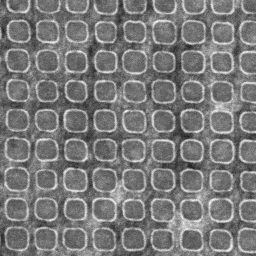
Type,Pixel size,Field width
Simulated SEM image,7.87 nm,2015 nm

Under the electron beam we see a regular array of raised bodies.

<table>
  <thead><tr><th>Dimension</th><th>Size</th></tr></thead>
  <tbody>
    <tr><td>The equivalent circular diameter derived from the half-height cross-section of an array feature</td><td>186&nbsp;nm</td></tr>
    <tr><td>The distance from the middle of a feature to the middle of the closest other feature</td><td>228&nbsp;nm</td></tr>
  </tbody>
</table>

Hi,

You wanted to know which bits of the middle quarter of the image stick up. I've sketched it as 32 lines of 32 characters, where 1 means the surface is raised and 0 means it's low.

11111100111110011111001111110011
01111000111110011111000111100011
00000000000000000000000000000000
00000000000000000000000000000000
01111000111000001110000111100011
11111100111110011111001111110011
11111100111110011111001111110011
01111100111110011111001111110011
01111100111110011111001111110011
00000000000000000000000001100001
00000000000000000000000000000000
00000000000000000000000000000001
11111000111110011111001111100111
11111101111110011111001111100111
11111100111110011111001111100111
11111100111110011111001111100111
01111000111100001111000111100011
00000000000000000000000000000000
00000000000000000000000000000000
01111000111110011111001111100011
11111101111110111111001111100111
11111101111110011111001111100111
11111100111110011111001111100111
01111100111110011111001111100011
00000000000000000000000000000000
00000000000000000000000000000000
01110000111100000000000111000000
11111001111110011111001111100111
11111101111110011111001111100111
11111101111110011111001111110111
11111101111110011111001111110111
01111000111110001111000000000011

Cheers